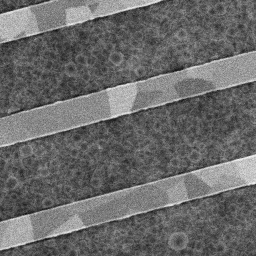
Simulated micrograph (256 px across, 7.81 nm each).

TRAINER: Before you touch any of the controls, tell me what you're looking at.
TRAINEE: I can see one or a few lines or trenches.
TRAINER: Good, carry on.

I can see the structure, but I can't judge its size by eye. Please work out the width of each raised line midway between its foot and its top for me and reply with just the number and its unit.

216 nm